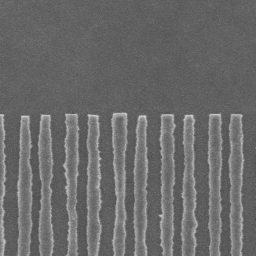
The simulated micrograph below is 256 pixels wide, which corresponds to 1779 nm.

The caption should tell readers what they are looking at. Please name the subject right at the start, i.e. parallel lines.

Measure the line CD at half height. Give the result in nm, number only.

78.2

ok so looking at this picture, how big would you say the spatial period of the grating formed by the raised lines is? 163 nm